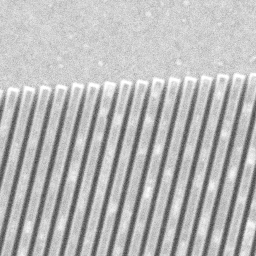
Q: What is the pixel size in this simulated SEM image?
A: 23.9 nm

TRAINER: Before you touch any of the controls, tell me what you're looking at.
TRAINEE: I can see parallel lines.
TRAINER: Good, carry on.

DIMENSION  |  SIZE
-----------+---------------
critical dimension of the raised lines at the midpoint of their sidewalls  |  0.206 microns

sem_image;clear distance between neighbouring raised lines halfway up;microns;0.16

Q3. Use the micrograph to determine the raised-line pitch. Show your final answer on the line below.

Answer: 370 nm